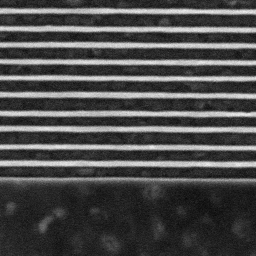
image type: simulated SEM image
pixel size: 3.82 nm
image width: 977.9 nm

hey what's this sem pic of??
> parallel lines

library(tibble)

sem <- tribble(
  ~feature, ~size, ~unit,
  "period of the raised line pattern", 16.9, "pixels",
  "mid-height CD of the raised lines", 4.24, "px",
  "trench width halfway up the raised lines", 48.2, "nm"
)